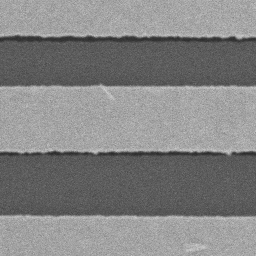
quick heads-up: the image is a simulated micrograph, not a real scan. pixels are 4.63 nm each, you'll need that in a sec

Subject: lines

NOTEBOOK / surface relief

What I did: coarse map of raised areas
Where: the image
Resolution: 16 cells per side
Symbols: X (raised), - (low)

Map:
XXXXXXXXXXXXXXXX
XXXXXXXXXXXXXXXX
----------------
----------------
----------------
XXXXXXXXXXXXXXXX
XXXXXXXXXXXXXXXX
XXXXXXXXXXXXXXXX
XXXXXXXXXXXXXXXX
-XX--X--------X-
----------------
----------------
----------------
----------------
XXXXXXXXXXXXXXXX
XXXXXXXXXXXXXXXX